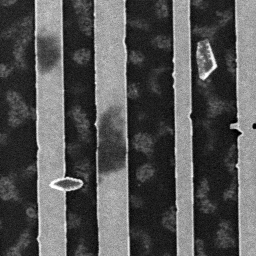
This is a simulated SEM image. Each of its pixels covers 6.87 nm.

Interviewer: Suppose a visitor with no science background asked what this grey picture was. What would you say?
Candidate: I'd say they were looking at one or a few lines or trenches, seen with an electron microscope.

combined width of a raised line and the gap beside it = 454 nanometers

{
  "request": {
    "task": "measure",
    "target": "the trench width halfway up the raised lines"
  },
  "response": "0.319 microns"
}